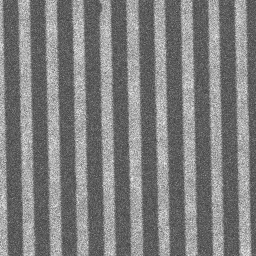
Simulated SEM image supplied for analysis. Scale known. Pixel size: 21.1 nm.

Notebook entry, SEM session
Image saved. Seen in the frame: parallel lines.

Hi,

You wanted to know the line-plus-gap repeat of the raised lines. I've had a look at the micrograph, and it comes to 0.57 um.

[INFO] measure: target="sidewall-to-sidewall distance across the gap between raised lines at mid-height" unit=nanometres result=337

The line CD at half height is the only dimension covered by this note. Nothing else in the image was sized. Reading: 232 nanometres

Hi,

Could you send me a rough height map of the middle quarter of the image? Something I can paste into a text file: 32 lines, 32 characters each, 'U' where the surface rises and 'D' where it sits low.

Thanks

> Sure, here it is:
DDDUUDDDDUUUDDDDUUUDDDDUUUDDDDUU
DDDUUDDDDUUUDDDDUUUDDDDUUUDDDDUU
DDDUUDDDDUUUDDDDUUUDDDDUUUDDDDUU
DDDUUDDDDUUUDDDDUUUDDDDUUUDDDDUU
DDDUUDDDDUUUDDDDUUUDDDDUUUDDDDUU
DDDUUDDDDUUUDDDDUUUDDDDUUUDDDDUU
DDDUUDDDDUUUDDDDUUUDDDDUUUDDDDUU
DDDUUDDDDUUUDDDDUUUDDDDUUUDDDDUU
DDDUUDDDDUUUDDDDUUUDDDDUUUDDDDUU
DDDUUDDDDUUUDDDDUUUDDDDUUUDDDDUU
DDDUUDDDDDUUDDDDUUUDDDDUUUDDDDUU
DDDUUDDDDDUUDDDDUUUDDDDUUUDDDDUU
DDDUUDDDDDUUDDDDUUUDDDDUUUDDDDUU
DDDUUDDDDDUUDDDDUUUDDDDUUUDDDDUU
DDDUUDDDDDUUDDDDUUUDDDDUUUDDDDUU
DDDUUDDDDDUUDDDDUUUDDDDUUUDDDDUU
DDDUUDDDDDUUDDDDUUUDDDDUUUDDDDUU
DDDUUDDDDDUUDDDDUUUDDDDUUUDDDDUU
DDDUUDDDDDUUDDDDUUUDDDDUUUDDDDUU
DDDUUDDDDDUUDDDDUUUDDDDUUUDDDDUU
DDDUUDDDDDUUDDDDUUUDDDDUUUDDDDUU
DDDUUDDDDDUUDDDDUUUDDDDUUUDDDDUU
DDDUUUDDDDUUDDDDUUUDDDDUUUDDDDUU
DDDUUUDDDDUUDDDDDUUDDDDUUUDDDDUU
DDDUUUDDDDUUDDDDDUUDDDDUUUDDDDUU
DDDUUUDDDDUUDDDDDUUDDDDUUUDDDDUU
DDDUUUDDDDUUDDDDDUUDDDDDUUDDDDUU
DDDUUUDDDDUUDDDDDUUDDDDDUUDDDDUU
DDDUUUDDDDUUDDDDDUUDDDDDUUDDDDUU
DDDUUUDDDDUUDDDDDUUDDDDDUUDDDDUU
DDDUUDDDDDUUDDDDDUUDDDDDUUDDDDUU
DDDUUUDDDDUUDDDDDUUDDDDDUUDDDDUU